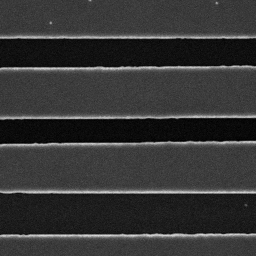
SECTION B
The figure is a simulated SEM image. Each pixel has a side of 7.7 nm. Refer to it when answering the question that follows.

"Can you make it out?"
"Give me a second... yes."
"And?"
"lines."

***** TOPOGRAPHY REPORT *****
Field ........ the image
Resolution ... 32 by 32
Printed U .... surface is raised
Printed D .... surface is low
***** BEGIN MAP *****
UUUUUUUUUUUUUUUUUUUUUUUUUUUUUUUU
UUUUUUUUUUUUUUUUUUUUUUUUUUUUUUUU
UUUUUUUUUUUUUUUUUUUUUUUUUUUUUUUU
UUUUUUUUUUUUUUUUUUUUUUUUUUUUUUUU
UUUUUUUUUUUUUUUUUUUUUUUUUUUUUUUU
DDDDDDDDDDDDDDDDDDDDDDDDDDDDDDDD
DDDDDDDDDDDDDDDDDDDDDDDDDDDDDDDD
DDDDDDDDDDDDDDDDDDDDDDDDDDDDDDDD
UUUUUUUUUUUUUUUUUUUUUUUUUUUUUUUU
UUUUUUUUUUUUUUUUUUUUUUUUUUUUUUUU
UUUUUUUUUUUUUUUUUUUUUUUUUUUUUUUU
UUUUUUUUUUUUUUUUUUUUUUUUUUUUUUUU
UUUUUUUUUUUUUUUUUUUUUUUUUUUUUUUU
UUUUUUUUUUUUUUUUUUUUUUUUUUUUUUUU
UUUUUUUUUUUUUUUUUUUUUUUUUUUUUUUU
DDDDDDDDDDDDDDDDDDDDDDDDDDDDDDDD
DDDDDDDDDDDDDDDDDDDDDDDDDDDDDDDD
DDDDDDDDDDDDDDDDDDDDDDDDDDDDDDDD
UUUUUUUUUUUUUUUUUUUUUUUUUUUUUUUU
UUUUUUUUUUUUUUUUUUUUUUUUUUUUUUUU
UUUUUUUUUUUUUUUUUUUUUUUUUUUUUUUU
UUUUUUUUUUUUUUUUUUUUUUUUUUUUUUUU
UUUUUUUUUUUUUUUUUUUUUUUUUUUUUUUU
UUUUUUUUUUUUUUUUUUUUUUUUUUUUUUUU
DDDDDDDDDDDDDDDDDDDDDDDDDDDDDDDD
DDDDDDDDDDDDDDDDDDDDDDDDDDDDDDDD
DDDDDDDDDDDDDDDDDDDDDDDDDDDDDDDD
DDDDDDDDDDDDDDDDDDDDDDDDDDDDDDDD
DDDDDDDDDDDDDDDDDDDDDDDDDDDDDDDD
UUUUUUUUUUUUUUUUUUUUUUUUUUUUUUUU
UUUUUUUUUUUUUUUUUUUUUUUUUUUUUUUU
UUUUUUUUUUUUUUUUUUUUUUUUUUUUUUUU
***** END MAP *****